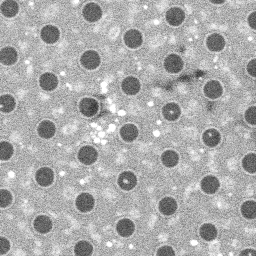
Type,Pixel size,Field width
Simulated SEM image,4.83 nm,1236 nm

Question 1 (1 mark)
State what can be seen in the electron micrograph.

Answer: a regular array of raised bodies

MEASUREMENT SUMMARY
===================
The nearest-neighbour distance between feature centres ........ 228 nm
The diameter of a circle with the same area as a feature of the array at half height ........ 107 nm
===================